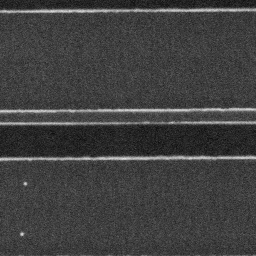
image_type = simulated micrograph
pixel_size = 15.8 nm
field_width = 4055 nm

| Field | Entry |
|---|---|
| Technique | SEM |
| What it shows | lines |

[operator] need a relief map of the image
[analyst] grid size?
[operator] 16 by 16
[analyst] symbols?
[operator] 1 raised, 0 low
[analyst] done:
1111111111111111
0000000000000000
0000000000000000
0000000000000000
0000000000000000
0000000000000000
0000000000000000
0000000000000000
1111111111111111
1111111111111111
0000000000000000
0000000000000000
0000000000000000
0000000000000000
0000000000000000
0000000000000000